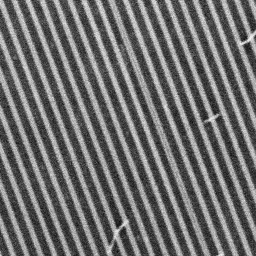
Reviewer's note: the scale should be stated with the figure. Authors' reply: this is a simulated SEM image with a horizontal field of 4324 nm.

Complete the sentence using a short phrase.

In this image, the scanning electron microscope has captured parallel lines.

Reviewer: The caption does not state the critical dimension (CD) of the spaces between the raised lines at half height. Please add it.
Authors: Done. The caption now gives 156 nm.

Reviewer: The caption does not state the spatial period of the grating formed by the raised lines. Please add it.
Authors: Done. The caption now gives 0.22 um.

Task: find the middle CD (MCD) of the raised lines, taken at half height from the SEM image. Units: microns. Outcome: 0.0632